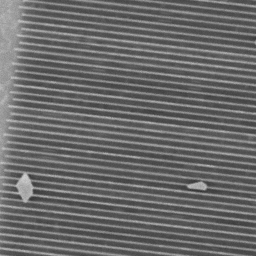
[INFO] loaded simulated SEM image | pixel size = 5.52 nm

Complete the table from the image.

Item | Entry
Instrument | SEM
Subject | parallel lines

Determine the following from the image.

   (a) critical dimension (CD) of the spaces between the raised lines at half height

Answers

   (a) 30.8 nm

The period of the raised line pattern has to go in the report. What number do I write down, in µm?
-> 0.0393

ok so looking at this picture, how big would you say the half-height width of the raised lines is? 10.3 nanometers